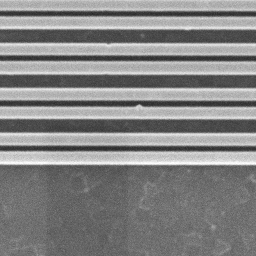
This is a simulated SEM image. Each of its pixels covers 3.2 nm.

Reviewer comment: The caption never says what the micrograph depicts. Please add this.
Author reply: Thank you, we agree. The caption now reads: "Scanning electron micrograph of parallel lines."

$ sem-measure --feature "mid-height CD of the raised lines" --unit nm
37.1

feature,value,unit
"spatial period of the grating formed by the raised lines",0.0719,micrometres